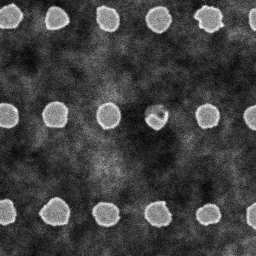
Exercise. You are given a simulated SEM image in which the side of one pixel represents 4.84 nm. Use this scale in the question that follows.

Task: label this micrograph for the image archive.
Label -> a regular array of raised bodies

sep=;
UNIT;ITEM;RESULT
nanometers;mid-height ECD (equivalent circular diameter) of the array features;121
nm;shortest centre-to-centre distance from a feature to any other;245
